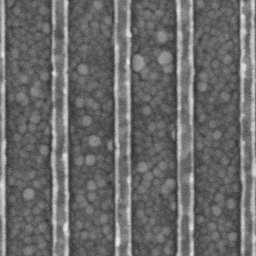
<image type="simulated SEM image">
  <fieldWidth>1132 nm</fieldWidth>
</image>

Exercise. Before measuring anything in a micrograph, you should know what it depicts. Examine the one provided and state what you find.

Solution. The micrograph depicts one or a few lines or trenches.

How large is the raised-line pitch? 0.277 microns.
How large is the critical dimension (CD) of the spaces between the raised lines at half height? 215 nanometers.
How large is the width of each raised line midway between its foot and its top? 0.063 microns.